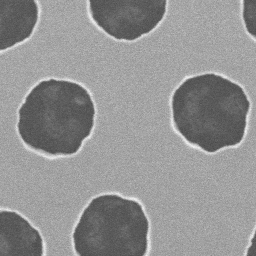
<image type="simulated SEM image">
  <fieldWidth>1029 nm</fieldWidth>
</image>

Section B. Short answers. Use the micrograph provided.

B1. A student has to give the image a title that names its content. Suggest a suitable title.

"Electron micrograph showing holes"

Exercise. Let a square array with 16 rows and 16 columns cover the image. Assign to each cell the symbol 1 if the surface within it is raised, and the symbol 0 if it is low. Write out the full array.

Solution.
0011110000111110
0011110000111110
0011111111111111
1111111111111111
1111111111111111
1100011111100001
1000001111100000
1000001111100001
1000011111100001
1110011111111111
1111111111111111
1111111111111111
1111110011111111
0111100001111111
0011100001111111
0001100001111111